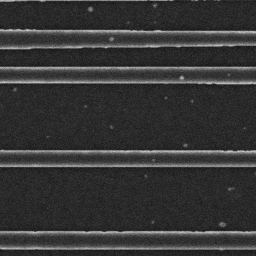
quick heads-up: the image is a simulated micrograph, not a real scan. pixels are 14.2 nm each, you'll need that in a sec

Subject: lines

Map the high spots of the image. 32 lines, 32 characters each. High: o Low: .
................................
................................
................................
................................
oooooooooooooooooooooooooooooooo
oooooooooooooooooooooooooooooooo
................................
................................
oooooooooooooooooooooooooooooooo
oooooooooooooooooooooooooooooooo
................................
................................
................................
................................
................................
................................
................................
................................
................................
oooooooooooooooooooooooooooooooo
oooooooooooooooooooooooooooooooo
................................
................................
................................
................................
................................
................................
................................
................................
oooooooooooooooooooooooooooooooo
oooooooooooooooooooooooooooooooo
................................